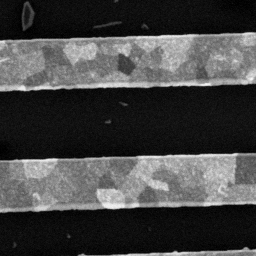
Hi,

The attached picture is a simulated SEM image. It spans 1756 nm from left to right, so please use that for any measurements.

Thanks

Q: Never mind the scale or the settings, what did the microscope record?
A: lines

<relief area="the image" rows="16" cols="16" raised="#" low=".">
................
................
..##############
################
################
####............
................
................
................
................
################
################
################
................
................
................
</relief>